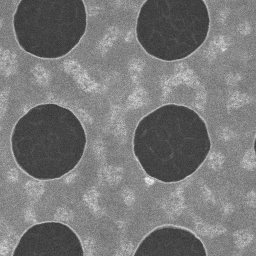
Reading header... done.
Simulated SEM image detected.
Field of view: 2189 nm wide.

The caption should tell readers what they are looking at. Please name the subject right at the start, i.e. holes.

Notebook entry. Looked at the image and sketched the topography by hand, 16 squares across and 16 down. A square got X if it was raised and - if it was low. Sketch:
X----XXXX----XXX
X----XXXX----XXX
X----XXXX----XXX
XX--XXXXXX--XXXX
XXXXXXXXXXXXXXXX
XXXXXXXXXXXXXXXX
XXXXXXXXXXXXXXXX
X----XXXX----XXX
X----XXX-----XXX
X----XXX-----XXX
X----XXXX---XXXX
XXXXXXXXXXXXXXXX
XXXXXXXXXXXXXXXX
XXXXXXXXXXXXXXXX
XX---XXXXX--XXXX
X----XXXX----XXX